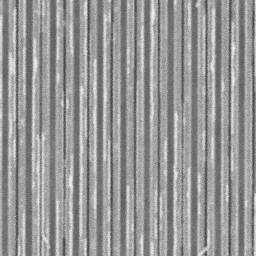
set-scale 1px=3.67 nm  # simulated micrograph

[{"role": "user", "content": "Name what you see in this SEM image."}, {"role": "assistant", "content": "parallel lines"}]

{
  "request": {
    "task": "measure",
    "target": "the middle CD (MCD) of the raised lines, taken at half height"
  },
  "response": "27.5 nm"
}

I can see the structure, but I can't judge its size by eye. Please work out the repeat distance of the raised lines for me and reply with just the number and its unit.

43.3 nm